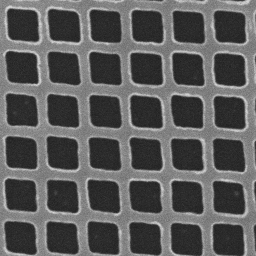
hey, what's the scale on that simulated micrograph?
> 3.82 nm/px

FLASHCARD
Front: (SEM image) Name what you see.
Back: a regular array of holes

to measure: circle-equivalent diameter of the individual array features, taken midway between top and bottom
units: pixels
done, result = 35.2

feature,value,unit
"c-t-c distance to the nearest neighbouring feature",158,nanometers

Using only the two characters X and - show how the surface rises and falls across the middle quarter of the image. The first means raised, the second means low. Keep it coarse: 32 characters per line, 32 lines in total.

----XX--------XXX--------XX-----
----XX--------XXX--------XX-----
----XX--------XXX--------XX-----
----XXX--------XX--------XX-----
----XXX--------XX--------XXX----
XXXXXXXXXXXX--XXXXXXXXXXXXXXXXXX
XXXXXXXXXXXXXXXXXXXXXXXXXXXXXXXX
XXXXXXXXXXXXXXXXXXXXXXXXXXXXXXXX
---XXX--------XX-------XXXX-----
----XX--------XX--------XXX-----
----XX--------XX--------XXX-----
----XX--------XX--------XXX-----
----XX--------XXX--------XX-----
----XX---------XX--------XX-----
----XXX--------XX--------XX-----
----XXX-------XXXX-------XXX----
XXXXXXXXXXXXXXXXXXXXXXXXXXXXXXXX
XXXXXXXXXXXXXXXXXXXXXXXXXXXXXXXX
-XXXXXX-----XXXXX---X-XXXXXXXXXX
---XXX--------XX--------XXX-----
----XX--------XXX-------XXX-----
---XXX--------XXX-------XXX-----
---XXX--------XXX--------XX-----
----XX--------XXX--------XX-----
----XX--------XXX--------XX-----
----XXX-------XXX--------XX-----
XX-XXXXXXX----XXXXX-----XXXXX---
XXXXXXXXXXXXXXXXXXXXXXXXXXXXXXXX
XXXXXXXXXXXXXXXXXXXXXXXXXXXXXXXX
---XXX-------XXXX------XXXX-----
---XXX--------XX--------XXX-----
----XX--------XX--------XXX-----